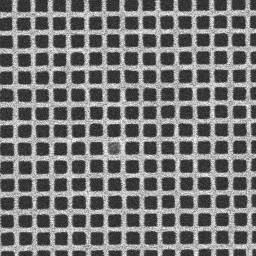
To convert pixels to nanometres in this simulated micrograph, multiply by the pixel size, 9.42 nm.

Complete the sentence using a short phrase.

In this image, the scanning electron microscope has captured a regular array of holes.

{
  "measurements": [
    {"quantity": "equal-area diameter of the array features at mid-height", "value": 141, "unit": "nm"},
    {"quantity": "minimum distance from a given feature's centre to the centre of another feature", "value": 166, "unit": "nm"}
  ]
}